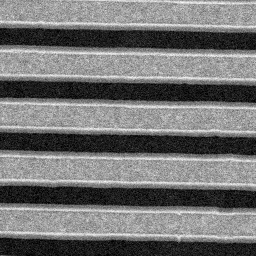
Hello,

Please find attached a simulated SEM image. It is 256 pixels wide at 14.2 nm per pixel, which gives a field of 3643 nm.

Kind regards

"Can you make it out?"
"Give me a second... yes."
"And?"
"parallel lines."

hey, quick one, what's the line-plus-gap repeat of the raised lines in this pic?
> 0.749 µm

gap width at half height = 24.9 px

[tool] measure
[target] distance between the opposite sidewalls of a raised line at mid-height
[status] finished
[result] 395 nanometres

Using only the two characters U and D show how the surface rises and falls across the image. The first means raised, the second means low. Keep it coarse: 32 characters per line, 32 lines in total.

UUUUUUUUUUUUUUUUUUUUUUUUUUUUUUUU
UUUUUUUUUUUUUUUUUUUUUUUUUUUUUUUU
UUUUUUUUUUUUUUUUUUUUUUUUUUUUUUUU
DDDDDDDDDDDDDDDDDDDDDDDDDUUUUUUU
DDDDDDDDDDDDDDDDDDDDDDDDDDDDDDDD
DDDDDDDDDDDDDDDDDDDDDDDDDDDDDDDD
UUUUUUUUUUUUUDUUUUUDDDDDDDDDDDDD
UUUUUUUUUUUUUUUUUUUUUUUUUUUUUUUU
UUUUUUUUUUUUUUUUUUUUUUUUUUUUUUUU
UUUUUUUUUUUUUUUUUUUUUUUUUUUUUUUU
DDDDDDDDDDDDDDDDDDDDDDDDDDDDDDDD
DDDDDDDDDDDDDDDDDDDDDDDDDDDDDDDD
DDDDDDDDDDDDDDDDDDDDDDDDDDDDDDDD
UUUUUUUUUUUUUUUUUUUUUUUUUUUUUUUU
UUUUUUUUUUUUUUUUUUUUUUUUUUUUUUUU
UUUUUUUUUUUUUUUUUUUUUUUUUUUUUUUU
DDDDDDDDDDDDDDDDDDUUDDUUUUUUUUUU
DDDDDDDDDDDDDDDDDDDDDDDDDDDDDDDD
DDDDDDDDDDDDDDDDDDDDDDDDDDDDDDDD
UUUUUUUUUUUDDDDDDDDDDDDDDDDDDDDD
UUUUUUUUUUUUUUUUUUUUUUUUUUUUUUUU
UUUUUUUUUUUUUUUUUUUUUUUUUUUUUUUU
UUUUUUUUUUUUUUUUUUUUUUUUUUUUUUUU
DDDDDDDDDDDDDDDDDDDDDDDDDDDDDDDD
DDDDDDDDDDDDDDDDDDDDDDDDDDDDDDDD
DDDDDDDDDDDDDDDDDDDDDDDDDDDDDDDD
UUUUUUUUUUUUUUUUUUUUUUUUUUUUDUUD
UUUUUUUUUUUUUUUUUUUUUUUUUUUUUUUU
UUUUUUUUUUUUUUUUUUUUUUUUUUUUUUUU
DDDDDDDDDUUUUUUUUUUUUUUUUUUUUUUU
DDDDDDDDDDDDDDDDDDDDDDDDDDDDDDDD
DDDDDDDDDDDDDDDDDDDDDDDDDDDDDDDD